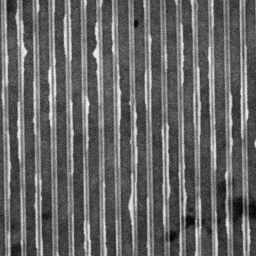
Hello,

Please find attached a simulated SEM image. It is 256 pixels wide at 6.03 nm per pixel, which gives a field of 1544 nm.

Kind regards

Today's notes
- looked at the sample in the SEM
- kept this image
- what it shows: parallel lines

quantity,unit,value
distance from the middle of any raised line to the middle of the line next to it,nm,95.8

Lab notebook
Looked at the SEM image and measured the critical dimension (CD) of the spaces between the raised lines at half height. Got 10.9 px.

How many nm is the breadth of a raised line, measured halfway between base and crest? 30.9